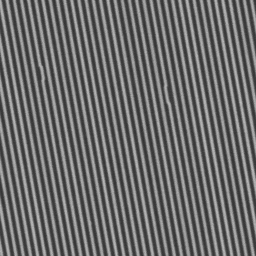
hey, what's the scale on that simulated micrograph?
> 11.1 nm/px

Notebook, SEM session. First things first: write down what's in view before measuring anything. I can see parallel lines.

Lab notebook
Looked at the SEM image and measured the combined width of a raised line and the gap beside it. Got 78.5 nanometers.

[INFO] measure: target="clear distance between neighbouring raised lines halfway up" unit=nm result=54.6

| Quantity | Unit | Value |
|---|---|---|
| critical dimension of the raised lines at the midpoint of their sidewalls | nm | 32.8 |